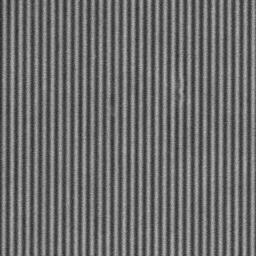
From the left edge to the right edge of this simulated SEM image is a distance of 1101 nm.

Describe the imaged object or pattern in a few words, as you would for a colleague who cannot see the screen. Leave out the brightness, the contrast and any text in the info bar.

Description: parallel lines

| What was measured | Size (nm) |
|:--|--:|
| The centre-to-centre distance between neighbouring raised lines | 34.5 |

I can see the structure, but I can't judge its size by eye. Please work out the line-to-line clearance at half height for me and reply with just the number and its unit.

22.6 nm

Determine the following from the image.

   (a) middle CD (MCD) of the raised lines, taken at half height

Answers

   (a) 11.8 nanometers